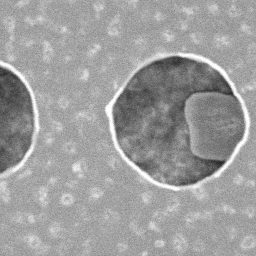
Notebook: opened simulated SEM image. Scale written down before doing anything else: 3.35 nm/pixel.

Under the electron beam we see holes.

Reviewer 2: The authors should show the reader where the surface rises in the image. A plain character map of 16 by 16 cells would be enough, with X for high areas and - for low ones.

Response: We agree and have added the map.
XXXXXXXXXXXXXXXX
XXXXXXXXXXXXXXXX
XXXXXXXXXXXXXXXX
XXXXXXXXXXXXXXXX
-XXXXXXXX-----XX
--XXXXXX------XX
--XXXXX--------X
--XXXXX--------X
--XXXXX--------X
--XXXXXX-------X
-XXXXXXXX-----XX
XXXXXXXXXX--XXXX
XXXXXXXXXXXXXXXX
XXXXXXXXXXXXXXXX
XXXXXXXXXXXXXXXX
XXXXXXXXXXXXXXXX